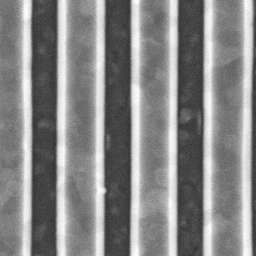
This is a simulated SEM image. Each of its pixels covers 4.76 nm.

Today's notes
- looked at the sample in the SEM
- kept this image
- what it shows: one or a few lines or trenches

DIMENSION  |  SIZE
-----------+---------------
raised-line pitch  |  0.349 µm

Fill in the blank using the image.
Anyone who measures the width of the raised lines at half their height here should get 188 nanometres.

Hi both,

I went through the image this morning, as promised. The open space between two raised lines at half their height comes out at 162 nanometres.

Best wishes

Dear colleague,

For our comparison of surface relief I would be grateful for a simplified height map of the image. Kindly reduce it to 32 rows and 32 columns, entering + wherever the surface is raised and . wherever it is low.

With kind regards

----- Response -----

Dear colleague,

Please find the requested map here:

+++.....+++++....+++++....+++++.
+++.....+++++....+++++....+++++.
+++.....+++++....+++++....+++++.
+++.....+++++....+++++....+++++.
+++.....+++++....+++++....+++++.
+++.....+++++....+++++....+++++.
+++.....+++++....+++++....+++++.
+++.....+++++....+++++....+++++.
+++.....+++++....+++++....+++++.
+++.....+++++....+++++....+++++.
+++.....+++++....+++++....+++++.
+++.....+++++....+++++....+++++.
+++.....+++++....+++++....+++++.
+++.....+++++....+++++....+++++.
+++.....+++++....+++++....+++++.
+++.....+++++....+++++....+++++.
++++....+++++....+++++....+++++.
+++.....+++++....+++++....+++++.
+++.....++++.....+++++....+++++.
+++.....++++.....+++++....+++++.
+++.....+++++....+++++....+++++.
+++.....+++++....+++++....+++++.
+++.....+++++....+++++....+++++.
+++.....+++++....+++++....+++++.
+++.....+++++....+++++....+++++.
+++.....+++++....+++++....+++++.
+++.....+++++....+++++....+++++.
+++.....+++++....+++++....+++++.
+++.....+++++....+++++....+++++.
+++.....+++++....+++++....+++++.
+++.....+++++....+++++....+++++.
+++.....+++++....+++++....+++++.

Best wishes